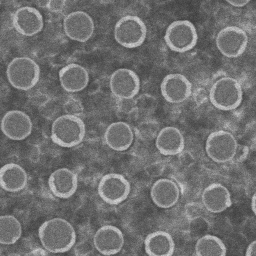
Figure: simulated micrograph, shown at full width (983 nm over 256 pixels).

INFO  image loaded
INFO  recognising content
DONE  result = a regular array of raised bodies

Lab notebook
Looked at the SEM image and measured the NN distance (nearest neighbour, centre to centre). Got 197 nanometers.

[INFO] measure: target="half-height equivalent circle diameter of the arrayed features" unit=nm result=113